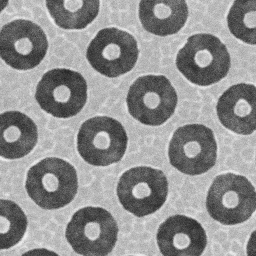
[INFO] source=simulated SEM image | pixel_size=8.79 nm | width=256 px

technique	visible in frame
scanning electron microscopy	a regular array of ring-shaped grooves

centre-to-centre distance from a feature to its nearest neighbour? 556 nm